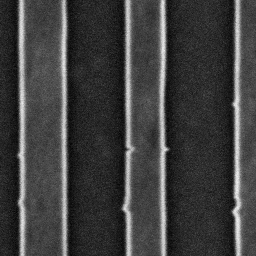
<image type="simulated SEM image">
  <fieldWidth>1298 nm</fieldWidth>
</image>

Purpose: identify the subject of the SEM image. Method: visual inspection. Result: one or a few lines or trenches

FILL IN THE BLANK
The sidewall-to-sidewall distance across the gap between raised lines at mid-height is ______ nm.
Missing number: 352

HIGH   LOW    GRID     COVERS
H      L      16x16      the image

LHHHLLLLHHLLLLLH
LHHHLLLLHHLLLLLH
LHHHLLLLHHLLLLLH
LHHHLLLLHHLLLLLH
LHHHLLLLHHLLLLLH
LHHHLLLLHHLLLLLH
LHHHLLLLHHLLLLLH
LHHHLLLLHHLLLLLH
LHHHLLLLHHLLLLLH
LHHHLLLLHHLLLLLH
LHHHLLLLHHLLLLLH
LHHHLLLLHHLLLLLH
LHHHLLLLHHLLLLLH
LHHHLLLLHHLLLLLH
LHHHLLLLHHLLLLLH
LHHHLLLLHHLLLLLH